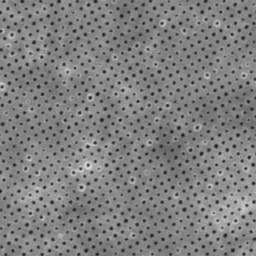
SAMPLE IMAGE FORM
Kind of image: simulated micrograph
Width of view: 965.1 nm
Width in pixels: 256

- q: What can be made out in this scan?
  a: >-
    a regular array of holes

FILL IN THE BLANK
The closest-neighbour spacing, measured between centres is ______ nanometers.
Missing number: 30.1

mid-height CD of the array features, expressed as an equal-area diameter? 0.0113 µm